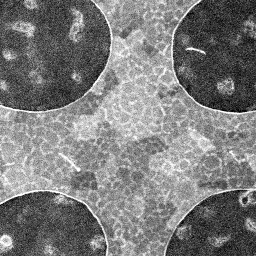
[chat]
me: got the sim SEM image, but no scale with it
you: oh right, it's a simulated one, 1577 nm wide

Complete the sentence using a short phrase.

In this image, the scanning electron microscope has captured holes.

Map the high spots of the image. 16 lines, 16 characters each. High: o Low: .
......oooooo....
.......oooo.....
.......oooo.....
.......oooo.....
......ooooo.....
......ooooo.....
....oooooooo....
oooooooooooooooo
oooooooooooooooo
oooooooooooooooo
oooooooooooooooo
oooooooooooooooo
.....oooooooo...
......oooooo....
......ooooo.....
.......ooo......